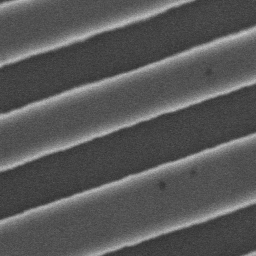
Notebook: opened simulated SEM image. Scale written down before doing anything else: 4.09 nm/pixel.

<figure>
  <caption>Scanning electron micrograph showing lines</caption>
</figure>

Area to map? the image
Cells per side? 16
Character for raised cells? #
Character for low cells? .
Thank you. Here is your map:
##########......
########........
#####.........##
##.........#####
........########
.....##########.
..##########....
#########.......
######..........
###..........###
#.........######
.......#########
....############
.############...
##########......
#######.........